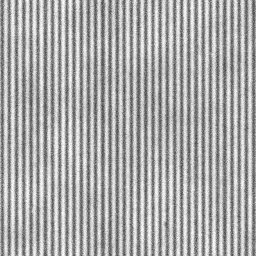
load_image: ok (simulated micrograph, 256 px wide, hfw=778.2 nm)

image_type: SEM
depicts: parallel lines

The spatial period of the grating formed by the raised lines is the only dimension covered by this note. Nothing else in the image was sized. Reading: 21.8 nanometres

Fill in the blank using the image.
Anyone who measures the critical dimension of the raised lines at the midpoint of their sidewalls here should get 10.6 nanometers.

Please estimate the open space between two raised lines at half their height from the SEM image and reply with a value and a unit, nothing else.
10.6 nm